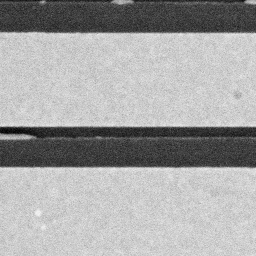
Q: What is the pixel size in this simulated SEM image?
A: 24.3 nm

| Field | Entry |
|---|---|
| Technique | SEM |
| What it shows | lines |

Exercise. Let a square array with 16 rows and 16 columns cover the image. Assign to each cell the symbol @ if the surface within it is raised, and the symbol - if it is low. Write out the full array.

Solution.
----------------
----------------
@@@@@@@@@@@@@@@@
@@@@@@@@@@@@@@@@
@@@@@@@@@@@@@@@@
@@@@@@@@@@@@@@@@
@@@@@@@@@@@@@@@@
@@@@@@@@@@@@@@@@
----------------
----------------
----------------
@@@@@@@@@@@@@@@@
@@@@@@@@@@@@@@@@
@@@@@@@@@@@@@@@@
@@@@@@@@@@@@@@@@
@@@@@@@@@@@@@@@@